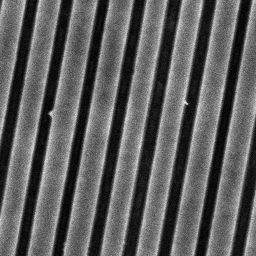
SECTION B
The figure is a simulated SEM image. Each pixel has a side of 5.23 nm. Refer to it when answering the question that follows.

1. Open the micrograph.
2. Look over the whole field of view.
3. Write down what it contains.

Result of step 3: parallel lines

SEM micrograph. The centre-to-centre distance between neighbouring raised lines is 35.1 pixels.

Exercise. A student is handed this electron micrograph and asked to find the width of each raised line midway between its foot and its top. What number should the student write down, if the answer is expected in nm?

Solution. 127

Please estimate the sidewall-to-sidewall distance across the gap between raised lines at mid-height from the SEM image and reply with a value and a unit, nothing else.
0.0611 µm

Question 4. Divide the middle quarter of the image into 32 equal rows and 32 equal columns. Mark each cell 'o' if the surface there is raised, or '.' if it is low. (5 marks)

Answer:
oooooo..oooooo....ooooo...oooooo
oooooo..oooooo...oooooo...oooooo
ooooo...oooooo...oooooo...oooooo
ooooo...oooooo...oooooo...oooooo
ooooo...oooooo...ooooo....ooooo.
ooooo..ooooooo...ooooo....ooooo.
ooooo..oooooo...oooooo...oooooo.
oooo...oooooo...oooooo...oooooo.
oooo...oooooo...oooooo...oooooo.
oooo...oooooo...ooooo....oooooo.
oooo...oooooo...ooooo....ooooo..
oooo..ooooooo...ooooo...oooooo..
oooo..oooooo...oooooo...oooooo..
ooo...oooooo...oooooo...oooooo..
ooo...oooooo...oooooo...oooooo..
ooo...oooooo...ooooo....ooooo...
ooo..ooooooo...ooooo....ooooo...
ooo..oooooo...oooooo...oooooo...
oo...oooooo...oooooo...oooooo...
oo...oooooo...oooooo...oooooo...
oo...oooooo...oooooo...ooooo....
oo...oooooo...ooooo....ooooo...o
oo..ooooooo...ooooo...oooooo...o
oo..oooooo...oooooo...oooooo...o
o...oooooo...oooooo...oooooo...o
o...oooooo...oooooo...oooooo...o
o...oooooo...ooooo....ooooo...oo
o..ooooooo...ooooo....ooooo...oo
o..oooooo...oooooo...oooooo...oo
...oooooo...oooooo...oooooo...oo
...oooooo...oooooo...oooooo...oo
...oooooo...oooooo...ooooo....oo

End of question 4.